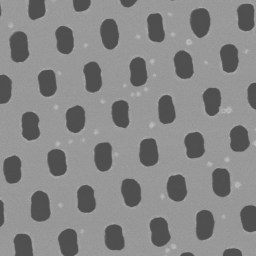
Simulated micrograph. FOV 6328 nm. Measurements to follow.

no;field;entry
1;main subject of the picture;a regular array of holes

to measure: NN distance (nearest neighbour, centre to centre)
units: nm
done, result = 1120